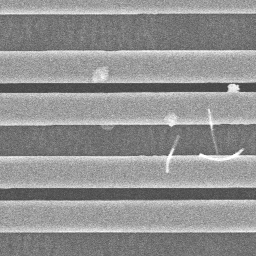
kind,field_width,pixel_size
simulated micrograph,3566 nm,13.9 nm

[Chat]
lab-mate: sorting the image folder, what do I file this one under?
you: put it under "lines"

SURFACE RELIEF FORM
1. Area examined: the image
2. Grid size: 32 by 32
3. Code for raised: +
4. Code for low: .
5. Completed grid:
++++++++++++++++++++++++++++++++
++++++++++++++++++++++++++++++++
................................
................................
................................
................................
++++++++++++++++++++++++++++++++
++++++++++++++++++++++++++++++++
++++++++++++++++++++++++++++++++
++++++++++++++++++++++++++++++++
............................++..
............................++..
++++++++++++++++++++++++++++++++
++++++++++++++++++++++++++++++++
++++++++++++++++++++++++++++++++
+++++++++++++++++++++++++++.....
................................
................................
................................
.....................+.+++++++++
++++++++++++++++++++++++++++++++
++++++++++++++++++++++++++++++++
++++++++++++++++++++++++++++++++
++..............................
................................
++++++++++++++++++++++++++++++++
++++++++++++++++++++++++++++++++
++++++++++++++++++++++++++++++++
++++++++++++++++++++++++++++++++
................................
................................
................................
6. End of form